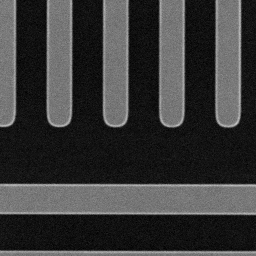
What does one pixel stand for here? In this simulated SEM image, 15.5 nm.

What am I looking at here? groups of lines, slits or small figures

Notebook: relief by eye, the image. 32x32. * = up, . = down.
**....***....***....***....***..
**....***....***....***....***..
**....***....***....***....***..
**....***....***....***....***..
**....***....***....***....***..
**....***....***....***....***..
**....***....***....***....***..
**....***....***....***....***..
**....***....***....***....***..
**....***....***....***....***..
**....***....***....***....***..
**....***....***....***....***..
**....***....***....***....***..
**....***....***....***....***..
**....***....***....***....***..
*.....**......*.....**.....***..
................................
................................
................................
................................
................................
................................
................................
********************************
********************************
********************************
********************************
................................
................................
................................
................................
................................